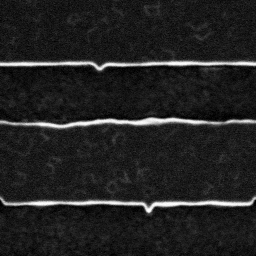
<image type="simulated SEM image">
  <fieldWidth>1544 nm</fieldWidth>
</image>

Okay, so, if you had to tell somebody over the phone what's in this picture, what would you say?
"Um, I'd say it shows one or a few lines or trenches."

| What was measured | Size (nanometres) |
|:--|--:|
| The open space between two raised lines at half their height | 343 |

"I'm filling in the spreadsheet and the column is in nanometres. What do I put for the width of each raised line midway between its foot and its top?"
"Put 496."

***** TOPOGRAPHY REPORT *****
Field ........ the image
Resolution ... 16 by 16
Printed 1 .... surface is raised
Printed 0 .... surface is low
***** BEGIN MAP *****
1111111111111111
1111111111111111
1111111111111111
1111111111111111
0000000000000000
0000000000000000
0000000000000000
0000000000110000
1111111111111111
1111111111111111
1111111111111111
1111111111111111
1111111111111111
0000000000000000
0000000000000000
0000000000000000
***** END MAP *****